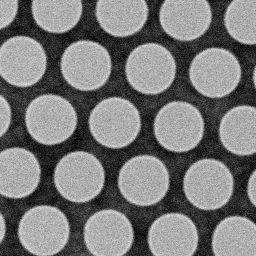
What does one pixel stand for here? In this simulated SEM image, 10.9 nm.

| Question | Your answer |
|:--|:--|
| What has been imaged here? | an array of small figures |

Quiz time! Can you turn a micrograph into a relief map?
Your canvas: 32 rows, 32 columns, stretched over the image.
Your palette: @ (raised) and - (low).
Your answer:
@@--@@@@@@--@@@@@@--@@@@@@---@@@
@@--@@@@@@--@@@@@@--@@@@@@--@@@@
@---@@@@@@--@@@@@@--@@@@@@--@@@@
-----@@@@----@@@@---@@@@@@--@@@@
---------------------@@@@----@@@
-@@@@----@@@--------------------
@@@@@---@@@@@----@@@@----@@@----
@@@@@@--@@@@@@--@@@@@@--@@@@@---
@@@@@@--@@@@@@--@@@@@@--@@@@@@--
@@@@@---@@@@@@--@@@@@@--@@@@@@--
--@@-----@@@@---@@@@@---@@@@@@--
------------------@@-----@@@@---
@---@@@@-----@@@----------------
@---@@@@@---@@@@@---@@@@------@@
@--@@@@@@--@@@@@@---@@@@@---@@@@
@--@@@@@@--@@@@@@--@@@@@@---@@@@
@---@@@@@--@@@@@@--@@@@@@---@@@@
-----@@@----@@@@@---@@@@@---@@@@
---------------------@@@----@@@@
@@@@----@@@@--------------------
@@@@@--@@@@@----@@@@----@@@@----
@@@@@--@@@@@@--@@@@@@--@@@@@@---
@@@@@--@@@@@@--@@@@@@--@@@@@@--@
@@@@---@@@@@@--@@@@@@--@@@@@@--@
-@@-----@@@@----@@@@---@@@@@@--@
-----------------@@-----@@@@----
----@@@-----@@@-----------------
---@@@@@---@@@@@----@@@@----@@@-
@-@@@@@@@--@@@@@---@@@@@---@@@@@
--@@@@@@---@@@@@@--@@@@@@--@@@@@
---@@@@@---@@@@@---@@@@@@--@@@@@
----@@@-----@@@@---@@@@@---@@@@@